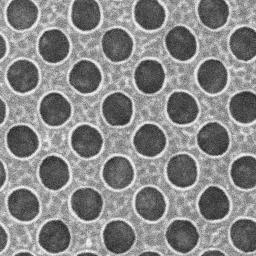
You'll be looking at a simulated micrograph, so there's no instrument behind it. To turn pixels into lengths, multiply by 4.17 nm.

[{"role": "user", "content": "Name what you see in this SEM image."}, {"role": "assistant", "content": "a regular array of holes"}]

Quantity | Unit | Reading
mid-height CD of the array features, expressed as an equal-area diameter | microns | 0.142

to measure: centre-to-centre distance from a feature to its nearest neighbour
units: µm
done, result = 0.185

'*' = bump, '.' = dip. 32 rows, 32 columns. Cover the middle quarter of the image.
**.......*********.......*******
*........*********.......*******
*.........*******........*******
*.........*******........*******
*........*********.......*******
**.......*********.......*******
***......**********.....****.***
****...****....*****..*****.....
.*********.......*********......
.********........*********......
..*******........*********......
..*******.........*******.......
..*******........*********......
..********.......*********......
.**********......**********.....
***....*****....***.....*****.**
**.......*********.......*******
**.......********........*******
*.........*******.........******
*.........*******.........******
**........*******.........******
**........********.......*******
***......**********.....****...*
****...****.....***********.....
.*********.......*********......
.*********.......*********......
..*******.........*******.......
..*******.........*******.......
..*******.........********......
.*********.......*********......
***********.....****..*****.....
***.....****..*****.....********